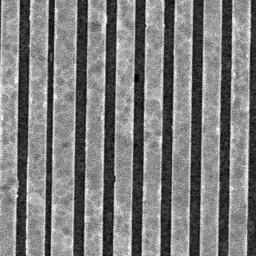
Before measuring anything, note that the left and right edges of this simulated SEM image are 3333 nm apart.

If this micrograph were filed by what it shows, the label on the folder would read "parallel lines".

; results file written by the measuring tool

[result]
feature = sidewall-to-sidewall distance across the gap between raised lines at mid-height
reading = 150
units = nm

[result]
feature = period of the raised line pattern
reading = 376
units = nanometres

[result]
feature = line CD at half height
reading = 229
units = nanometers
